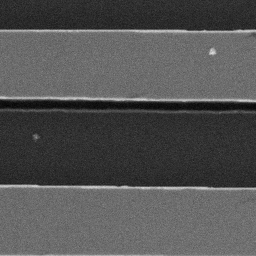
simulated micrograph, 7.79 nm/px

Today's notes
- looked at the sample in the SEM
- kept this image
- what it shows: lines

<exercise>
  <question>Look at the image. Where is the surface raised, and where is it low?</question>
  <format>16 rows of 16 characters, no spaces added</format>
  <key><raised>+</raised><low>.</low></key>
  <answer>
................
................
++++++++++++++++
++++++++++++++++
++++++++++++++++
++++++++++++++++
................
................
................
................
................
................
++++++++++++++++
++++++++++++++++
++++++++++++++++
++++++++++++++++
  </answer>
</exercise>